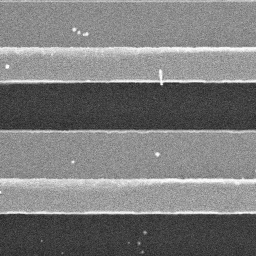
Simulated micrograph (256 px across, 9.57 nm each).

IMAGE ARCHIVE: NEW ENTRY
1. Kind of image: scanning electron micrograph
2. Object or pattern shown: lines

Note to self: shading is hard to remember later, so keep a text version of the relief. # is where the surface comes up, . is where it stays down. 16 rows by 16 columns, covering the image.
################
################
################
################
################
................
................
................
################
################
################
################
################
................
................
................